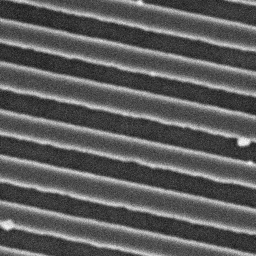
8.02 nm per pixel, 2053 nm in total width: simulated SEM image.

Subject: lines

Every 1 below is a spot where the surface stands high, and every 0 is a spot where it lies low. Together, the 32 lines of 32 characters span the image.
00001111111111111100000000000001
00000000111111111111111000000000
10000000000001111111111111110000
11111100000000000011111111111111
11111111110000000000000111111111
01111111111111100000000000011111
00000011111111111111000000000000
00000000001111111111111100000000
11110000000000011111111111111000
11111111000000000000111111111111
11111111111110000000000001111111
00111111111111111100000000000111
00000001111111111111110000000000
00000000000111111111111111100000
11110000000000000111111111111111
11111111100000000000001111111111
11111111111110000000000000111111
00001111111111111100000000000011
00000000111111111111111000000000
10000000000001111111111111100000
11111000000000000011111111111111
11111111110000000000000111111111
11111111111111000000000000011111
00001111111111111110000000000000
00000000011111111111111100000000
11000000000001111111111111111000
11111110000000000001111111111111
11111111111100000000000111111111
01111111111111110000000000001111
00000001111111111111100000000000
00000000000111111111111111000000
11100000000000001111111111111100